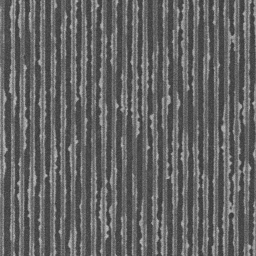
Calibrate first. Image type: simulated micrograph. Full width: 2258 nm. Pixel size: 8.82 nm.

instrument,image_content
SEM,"parallel lines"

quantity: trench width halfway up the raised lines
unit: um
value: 0.0485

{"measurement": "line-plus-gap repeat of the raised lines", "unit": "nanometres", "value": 89.7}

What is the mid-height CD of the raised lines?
44.1 nanometres